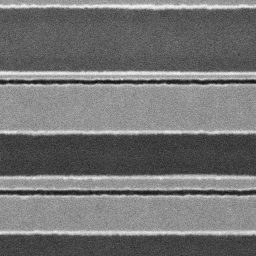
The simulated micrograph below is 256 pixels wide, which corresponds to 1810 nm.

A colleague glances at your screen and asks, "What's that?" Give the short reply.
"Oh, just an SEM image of lines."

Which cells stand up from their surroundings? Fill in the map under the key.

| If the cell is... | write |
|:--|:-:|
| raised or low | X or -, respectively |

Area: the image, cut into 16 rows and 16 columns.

----------------
----------------
----------------
----------------
----------------
XXXXXXXXXXXXXXXX
XXXXXXXXXXXXXXXX
XXXXXXXXXXXXXXXX
----------------
----------------
----------------
XXXXXXXXXXXXXXXX
XXXXXXXXXXXXXXXX
XXXXXXXXXXXXXXXX
XXXXXXXXXXXXXX-X
----------------